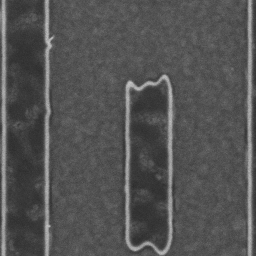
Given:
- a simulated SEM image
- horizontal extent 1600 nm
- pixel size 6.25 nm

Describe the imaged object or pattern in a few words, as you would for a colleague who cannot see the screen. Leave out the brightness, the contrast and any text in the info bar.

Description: one or a few lines or trenches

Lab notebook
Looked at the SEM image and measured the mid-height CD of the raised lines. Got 274 nm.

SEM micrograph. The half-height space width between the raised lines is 498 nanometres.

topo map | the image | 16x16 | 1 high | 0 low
1110000000000000
1110000000000000
1110000000000000
1110000000000000
1110000000000000
1110000011100000
1110000011100000
1110000011100000
1110000011100000
1110000011100000
1110000011100000
1110000011100000
1110000011100000
1110000011100000
1110000011100000
1110000000000000